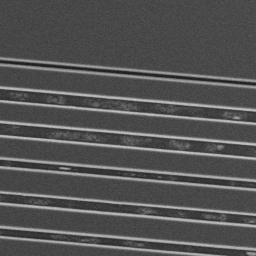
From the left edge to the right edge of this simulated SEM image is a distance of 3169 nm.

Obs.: parallel lines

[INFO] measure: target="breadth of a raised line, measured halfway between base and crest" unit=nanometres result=297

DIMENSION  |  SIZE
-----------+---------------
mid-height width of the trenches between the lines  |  126 nm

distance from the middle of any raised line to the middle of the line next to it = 429 nm